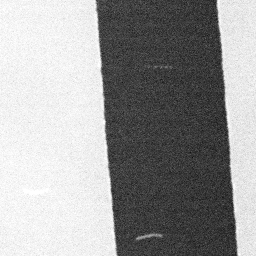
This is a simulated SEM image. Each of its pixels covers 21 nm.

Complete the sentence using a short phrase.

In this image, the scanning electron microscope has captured one or a few lines or trenches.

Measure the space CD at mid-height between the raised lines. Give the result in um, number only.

2.57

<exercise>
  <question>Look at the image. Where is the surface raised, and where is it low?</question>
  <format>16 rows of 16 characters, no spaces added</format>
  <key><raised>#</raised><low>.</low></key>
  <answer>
######........##
######........##
######........##
######........##
######........##
######........##
######........##
#######.......##
#######.......##
#######.......##
#######.......##
#######........#
#######........#
#######........#
#######........#
#######........#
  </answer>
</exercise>